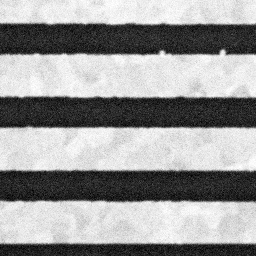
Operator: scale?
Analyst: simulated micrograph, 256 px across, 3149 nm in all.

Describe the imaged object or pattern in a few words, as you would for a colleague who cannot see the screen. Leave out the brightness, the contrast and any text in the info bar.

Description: lines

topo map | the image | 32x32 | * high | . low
********************************
********************************
********************************
................................
................................
................................
................................
********************************
********************************
********************************
********************************
********************************
................................
................................
................................
................................
********************************
********************************
********************************
********************************
********************************
................................
................................
................................
................................
********************************
********************************
********************************
********************************
********************************
................................
................................